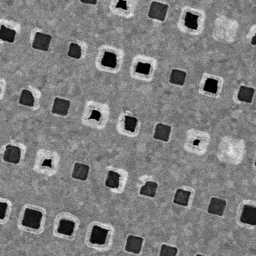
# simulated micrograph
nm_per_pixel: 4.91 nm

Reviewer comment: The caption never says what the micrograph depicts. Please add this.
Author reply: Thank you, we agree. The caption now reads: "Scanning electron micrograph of a regular array of holes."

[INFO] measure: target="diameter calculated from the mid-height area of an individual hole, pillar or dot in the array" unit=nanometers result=84.4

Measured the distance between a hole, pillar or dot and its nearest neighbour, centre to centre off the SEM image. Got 0.169 microns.